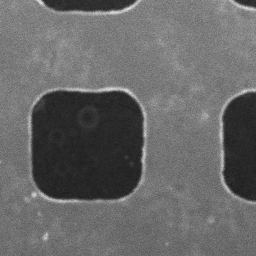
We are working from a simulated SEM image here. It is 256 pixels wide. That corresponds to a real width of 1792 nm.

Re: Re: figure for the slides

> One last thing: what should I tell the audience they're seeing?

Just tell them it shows holes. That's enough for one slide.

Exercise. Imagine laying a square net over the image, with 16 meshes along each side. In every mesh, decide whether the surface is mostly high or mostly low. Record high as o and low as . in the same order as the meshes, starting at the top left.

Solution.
ooo.....oooooooo
oooooooooooooooo
oooooooooooooooo
oooooooooooooooo
oooooooooooooooo
oooooooooooooooo
oo.......ooooo..
oo...o...ooooo..
oo.......ooooo..
oo.......ooooo..
oo.......ooooo..
oo.......ooooo..
oooo...oooooooo.
oooooooooooooooo
oooooooooooooooo
oooooooooooooooo